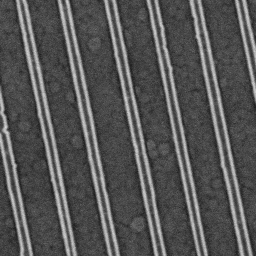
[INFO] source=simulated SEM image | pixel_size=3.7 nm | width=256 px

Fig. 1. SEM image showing parallel lines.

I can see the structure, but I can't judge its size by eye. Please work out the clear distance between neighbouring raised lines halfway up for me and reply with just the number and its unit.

124 nanometers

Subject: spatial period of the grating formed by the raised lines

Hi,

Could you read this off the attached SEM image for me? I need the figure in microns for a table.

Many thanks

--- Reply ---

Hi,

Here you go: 0.158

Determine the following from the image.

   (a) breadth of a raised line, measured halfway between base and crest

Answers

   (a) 31.7 nm